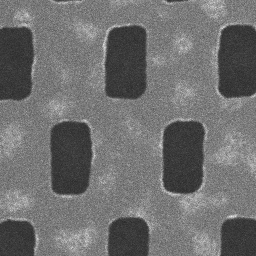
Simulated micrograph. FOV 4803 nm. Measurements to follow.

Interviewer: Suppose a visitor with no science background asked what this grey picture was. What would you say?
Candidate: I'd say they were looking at holes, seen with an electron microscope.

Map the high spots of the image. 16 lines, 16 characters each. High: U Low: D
UUUUUUUUUUUUUUUU
UUUUUUUUUUUUUUUU
DDUUUUUDDUUUUUDD
DDUUUUUDDUUUUUDD
DDUUUUUDDUUUUUDD
DDUUUUUDDUUUUUDD
UUUUUUUUUUUUUUUU
UUUUUUUUUUUUUUUU
UUUDDDUUUUDDDUUU
UUUDDDUUUUDDDUUU
UUUDDDUUUUDDDUUU
UUUDDDUUUUDDDUUU
UUUUUUUUUUUUUUUU
UUUUUUUUUUUUUUUU
DDUUUUUDDUUUUUDD
DDUUUUUDDUUUUUDD